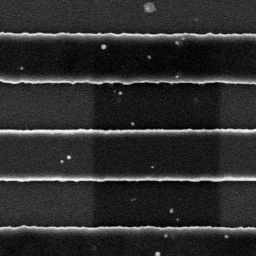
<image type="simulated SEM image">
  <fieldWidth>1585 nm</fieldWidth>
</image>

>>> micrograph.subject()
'lines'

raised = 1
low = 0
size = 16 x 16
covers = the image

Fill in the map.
0000000000000000
0000000000000000
1111111111111111
1111111111111111
1111111111111111
0000000000000000
0000000000000000
0000000000000000
1111111111111111
1111111111111111
1111111111111111
0000000000000000
0000000000000000
0000000000000000
1111111111111111
1111111111111111